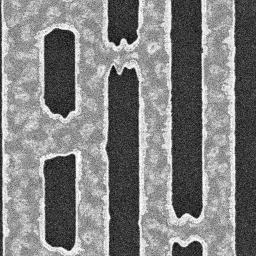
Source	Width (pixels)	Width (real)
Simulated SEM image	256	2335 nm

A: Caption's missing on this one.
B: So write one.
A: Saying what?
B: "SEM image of parallel lines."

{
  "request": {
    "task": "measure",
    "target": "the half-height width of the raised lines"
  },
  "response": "285 nm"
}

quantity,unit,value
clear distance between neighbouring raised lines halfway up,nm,301